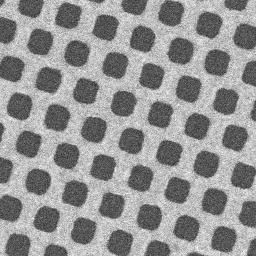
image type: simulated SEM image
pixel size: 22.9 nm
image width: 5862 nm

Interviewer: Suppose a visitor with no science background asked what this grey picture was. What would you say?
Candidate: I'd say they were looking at a regular array of holes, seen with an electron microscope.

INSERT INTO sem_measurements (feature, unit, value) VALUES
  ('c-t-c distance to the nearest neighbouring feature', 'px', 38.2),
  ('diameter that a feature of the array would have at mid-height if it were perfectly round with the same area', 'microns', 0.611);